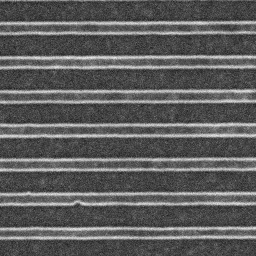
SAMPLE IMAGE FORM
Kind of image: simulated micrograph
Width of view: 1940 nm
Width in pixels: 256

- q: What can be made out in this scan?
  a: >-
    parallel lines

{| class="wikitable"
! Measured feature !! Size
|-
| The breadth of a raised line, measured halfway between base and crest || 80.5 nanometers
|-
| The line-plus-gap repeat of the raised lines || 259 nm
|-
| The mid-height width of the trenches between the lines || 180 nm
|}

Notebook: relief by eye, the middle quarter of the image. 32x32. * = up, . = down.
********************************
................................
................................
................................
................................
................................
................................
********************************
********************************
..**..................***.......
................................
................................
................................
................................
................................
********************************
********************************
********************************
................................
................................
................................
................................
................................
................................
********************************
********************************
.......................**...*...
................................
................................
................................
................................
................................